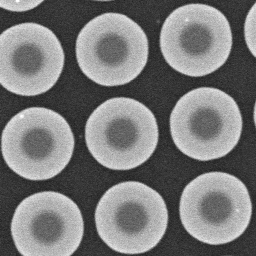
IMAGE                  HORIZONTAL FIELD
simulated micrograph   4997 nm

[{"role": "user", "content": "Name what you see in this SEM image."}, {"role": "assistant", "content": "an array of small figures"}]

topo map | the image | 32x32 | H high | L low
HHHHHLLLLLLLLLLLLLLLLLLLLLLLLLLL
LLLLLLLLLLLLLLLLLLLLLLHHHHHLLLLH
LLLLLLLLLLLLHHHHLLLLLHHHHHHHLLLH
LHHHHHLLLLHHHHHHHHLLHHHHHHHHHLLH
HHHHHHHLLLHHHHHHHHLLHHHHHHHHHLLH
HHHHHHHLLLHHHHHHHHLLHHHHHHHHHLLH
HHHHHHHHLLHHHHHHHHLLHHHHHHHHHLLH
HHHHHHHHLLHHHHHHHHLLLHHHHHHHLLLL
HHHHHHHHLLHHHHHHHHLLLLHHHHHLLLLL
HHHHHHHLLLLHHHHHHLLLLLLLHLLLLLLL
HHHHHHHLLLLLLHHLLLLLLLLLLLLLLLLL
LLHHHLLLLLLLLLLLLLLLLLLLHHHHLLLL
LLLLLLLLLLLLLLHHHLLLLLHHHHHHHLLL
LLLLHLLLLLLLHHHHHHLLLLHHHHHHHHLL
LLHHHHHHLLLHHHHHHHHLLHHHHHHHHHLL
LHHHHHHHLLLHHHHHHHHHLHHHHHHHHHLL
HHHHHHHHHLLHHHHHHHHHLHHHHHHHHHLL
HHHHHHHHHLLHHHHHHHHHLLHHHHHHHHLL
HHHHHHHHHLLHHHHHHHHLLLHHHHHHHLLL
HHHHHHHHHLLLHHHHHHHLLLLLHHHHLLLL
LHHHHHHHLLLLLHHHHHLLLLLLLLLLLLLL
LLHHHHHLLLLLLLLLLLLLLLLLLLLLLLLL
LLLLLLLLLLLLLLLLLLLLLLLLHHHHHHLL
LLLLLLLLLLLLLLHHHHHLLLLHHHHHHHHL
LLLLHHHHLLLLLHHHHHHHLLLHHHHHHHHL
LLLHHHHHHLLLHHHHHHHHHLLHHHHHHHHL
LLHHHHHHHHLLHHHHHHHHHLHHHHHHHHHL
LLHHHHHHHHLLHHHHHHHHHLLHHHHHHHHL
LHHHHHHHHHLLHHHHHHHHHLLHHHHHHHHL
LLHHHHHHHHLLLHHHHHHHLLLLHHHHHHLL
LLHHHHHHHHLLLHHHHHHHLLLLLLHLLLLL
LLHHHHHHHLLLLLLHHHLLLLLLLLLLLLLL